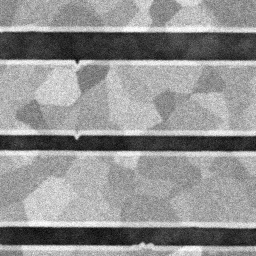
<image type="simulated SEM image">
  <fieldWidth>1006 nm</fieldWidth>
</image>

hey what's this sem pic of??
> one or a few lines or trenches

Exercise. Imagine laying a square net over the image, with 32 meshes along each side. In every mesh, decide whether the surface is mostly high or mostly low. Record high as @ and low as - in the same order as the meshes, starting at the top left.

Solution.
@@@@@@@@@@@@@@@@@@@@@@@@@@@@@@@@
@@@@@@@@@@@@@@@@@@@@@@@@@@@@@@@@
@@@@@@@@@@@@@@@@@@@@@@@@@@@@@@@@
@@@@@@@@@@@@@@@@@@@@@@@@@@@@@@@@
--------------------------------
--------------------------------
--------------------------------
--------------------------------
@@@@@@@@@@@@@@@@@@@@@@@@@@@@@@@@
@@@@@@@@@@@@@@@@@@@@@@@@@@@@@@@@
@@@@@@@@@@@@@@@@@@@@@@@@@@@@@@@@
@@@@@@@@@@@@@@@@@@@@@@@@@@@@@@@@
@@@@@@@@@@@@@@@@@@@@@@@@@@@@@@@@
@@@@@@@@@@@@@@@@@@@@@@@@@@@@@@@@
@@@@@@@@@@@@@@@@@@@@@@@@@@@@@@@@
@@@@@@@@@@@@@@@@@@@@@@@@@@@@@@@@
@@@@-@@@@@@@@@@@@@@@@@@@@@@@@@@@
--------------------------------
--------------------------------
@@@@@@@@@@@@@@@@@@@@@@@@@@@@@@@@
@@@@@@@@@@@@@@@@@@@@@@@@@@@@@@@@
@@@@@@@@@@@@@@@@@@@@@@@@@@@@@@@@
@@@@@@@@@@@@@@@@@@@@@@@@@@@@@@@@
@@@@@@@@@@@@@@@@@@@@@@@@@@@@@@@@
@@@@@@@@@@@@@@@@@@@@@@@@@@@@@@@@
@@@@@@@@@@@@@@@@@@@@@@@@@@@@@@@@
@@@@@@@@@@@@@@@@@@@@@@@@@@@@@@@@
@@@@@@@@@@@@@@@@@@@@@@@@@@@@@@@@
--------------------------------
--------------------------------
--------------------------------
@@@@@@@@@@@@@@@@@@@@@@@@@@@@@@@@